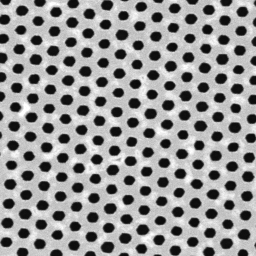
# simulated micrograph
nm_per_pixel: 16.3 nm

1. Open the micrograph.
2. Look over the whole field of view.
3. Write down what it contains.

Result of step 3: a regular array of holes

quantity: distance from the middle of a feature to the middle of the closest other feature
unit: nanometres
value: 312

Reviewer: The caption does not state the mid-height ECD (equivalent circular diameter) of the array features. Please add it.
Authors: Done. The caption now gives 0.186 µm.